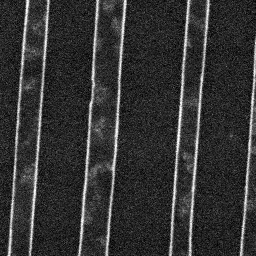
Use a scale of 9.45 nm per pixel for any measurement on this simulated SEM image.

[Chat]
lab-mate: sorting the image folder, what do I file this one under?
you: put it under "one or a few lines or trenches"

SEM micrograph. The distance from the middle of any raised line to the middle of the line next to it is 755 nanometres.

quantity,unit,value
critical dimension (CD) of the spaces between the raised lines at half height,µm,0.485